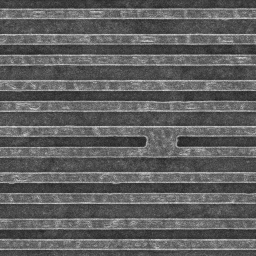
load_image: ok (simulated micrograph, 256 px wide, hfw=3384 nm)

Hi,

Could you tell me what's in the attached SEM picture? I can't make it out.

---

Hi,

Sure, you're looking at parallel lines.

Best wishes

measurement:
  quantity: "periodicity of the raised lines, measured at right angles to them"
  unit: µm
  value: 0.305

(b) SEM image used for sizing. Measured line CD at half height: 139 nm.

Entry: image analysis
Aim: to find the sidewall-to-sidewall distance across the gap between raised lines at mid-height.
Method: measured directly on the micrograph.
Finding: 14.4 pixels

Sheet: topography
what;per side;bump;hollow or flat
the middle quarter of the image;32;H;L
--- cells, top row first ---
LLLLLLLLLLLLLLLLLLLLLLLLLLLLLLLL
LLLLLLLLLLLLLLLLLLLLLLLLLLLLLLLL
LLLLLLLLLLLLLLLLLLLLLLLLLLLLLLLL
LLLLLLLLLLLLLLLLLLLLLLLLLLLLLLLL
HHHHHHHHHHHHHHHHHHHHHHHHHHHHHHHH
HHHHHHHHHHHHHHHHHHHHHHHHHHHHHHHH
HHHHHHHHHHHHHHHHHHHHHHHHHHHHHHHH
LLLLLLLLLLLLLLLLLLLLLLLLLLLLLLLL
LLLLLLLLLLLLLLLLLLLLLLLLLLLLLLLL
HHHHHHHHHHHHHHHHHHHHHHHHLLHHHHHH
HHHHHHHHHHHHHHHHHHHHHHHHHHHHHHHH
HHHHHHHHHHHHHHHHHHHHHHHHHHHHHHHH
LLLLLLLLLLLLLLLLLLLLLLLLLLLLLLLL
LLLLLLLLLLLLLLLLLLLLLLLLLLLLLLLL
LLLLLLLLLLLLLLLLLLLLLLLLLLLLLLLL
LLLLLLLLLLLLLLLLLLLLLLLLLLLLLLLL
HHHHHHHHHHHHHHHHHHHHHHHHHHHHHHHH
HHHHHHHHHHHHHHHHHHHHHHHHHHHHHHHH
LLLLLLLLLLLLLLLLLLLLLHHHHHHHLLLL
LLLLLLLLLLLLLLLLLLLLLHHHHHHHLLLL
LLLLLLLLLLLLLLLLLLLLHHHHHHHHHLLL
HHHHHHHHHHHHHHHHHHHHHHHHHHHHHHHH
HHHHHHHHHHHHHHHHHHHHHHHHHHHHHHHH
LLLLLLLLLLLLLLLLLLLLLLLLLLLLLLLL
LLLLLLLLLLLLLLLLLLLLLLLLLLLLLLLL
LLLLLLLLLLLLLLLLLLLLLLLLLLLLLLLL
LLLLLLLLLLLLLLLLLLLLLLLLLLLLLLLL
HHHHHHHHHHHHHHHHHHHHHHHHHHHHHHHH
HHHHHHHHHHHHHHHHHHHHHHHHHHHHHHHH
HHHHHHHHHHHHHHHHHHHHHHHHHHHHHHHH
LLLLLLLLLLLLLLLLLLLLLLLLLLLLLLLL
LLLLLLLLLLLLLLLLLLLLLLLLLLLLLLLL